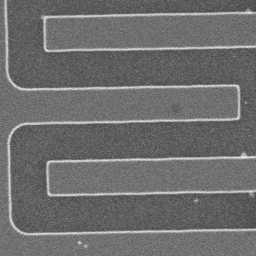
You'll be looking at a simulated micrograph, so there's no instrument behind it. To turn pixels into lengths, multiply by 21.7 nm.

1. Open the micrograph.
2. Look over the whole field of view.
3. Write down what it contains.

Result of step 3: groups of lines, slits or small figures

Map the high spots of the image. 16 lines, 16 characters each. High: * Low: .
................
...*************
...*************
................
................
*......********.
***************.
*************...
*...............
*...............
*..*************
*..*************
*...............
*...............
*........*******
****************